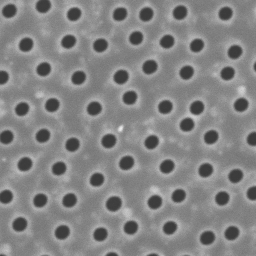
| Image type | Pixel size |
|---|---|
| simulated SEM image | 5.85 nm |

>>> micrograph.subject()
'a regular array of holes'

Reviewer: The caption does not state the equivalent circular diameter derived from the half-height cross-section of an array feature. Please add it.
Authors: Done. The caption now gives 86.3 nm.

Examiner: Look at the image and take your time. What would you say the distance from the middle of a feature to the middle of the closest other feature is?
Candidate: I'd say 28.9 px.